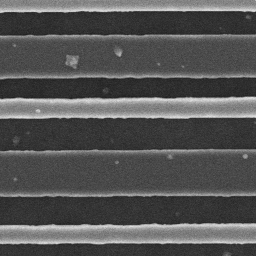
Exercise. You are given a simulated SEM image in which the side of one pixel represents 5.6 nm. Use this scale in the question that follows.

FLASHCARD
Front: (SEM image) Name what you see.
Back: lines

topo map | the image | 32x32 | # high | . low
################################
#...#...#.......................
................................
................................
...#.############.##############
################################
################################
################################
################################
################################
................................
................................
################################
################################
################################
................................
................................
................................
................................
################################
################################
################################
################################
################################
######..######..................
................................
................................
................................
################################
################################
................................
................................